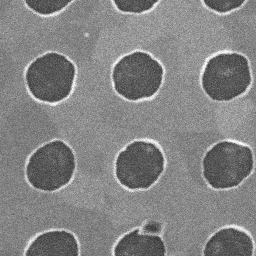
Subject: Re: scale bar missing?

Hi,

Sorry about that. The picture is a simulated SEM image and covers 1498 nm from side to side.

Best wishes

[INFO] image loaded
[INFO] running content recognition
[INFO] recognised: holes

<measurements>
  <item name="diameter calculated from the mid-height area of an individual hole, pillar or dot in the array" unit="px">49.3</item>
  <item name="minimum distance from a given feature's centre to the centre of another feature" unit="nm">512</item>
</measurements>